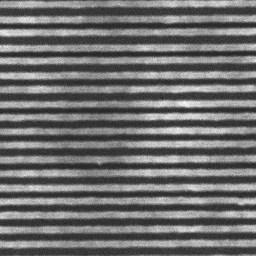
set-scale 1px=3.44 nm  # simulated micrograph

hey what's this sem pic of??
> parallel lines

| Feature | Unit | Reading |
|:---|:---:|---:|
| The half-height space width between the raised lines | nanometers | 26.2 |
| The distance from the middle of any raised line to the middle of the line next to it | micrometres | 0.0484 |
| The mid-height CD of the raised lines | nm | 20.6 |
